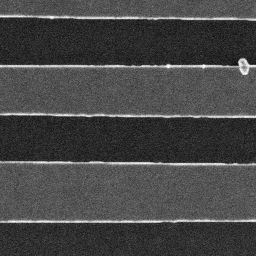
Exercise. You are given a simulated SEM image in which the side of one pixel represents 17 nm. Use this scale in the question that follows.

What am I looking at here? lines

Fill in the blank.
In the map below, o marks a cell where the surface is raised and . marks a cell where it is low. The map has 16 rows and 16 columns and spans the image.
oooooooooooooooo
................
................
................
oooooooooooooooo
oooooooooooooooo
oooooooooooooooo
................
................
................
oooooooooooooooo
oooooooooooooooo
oooooooooooooooo
oooooooooooooooo
................
................